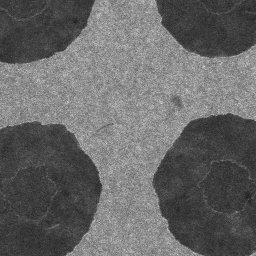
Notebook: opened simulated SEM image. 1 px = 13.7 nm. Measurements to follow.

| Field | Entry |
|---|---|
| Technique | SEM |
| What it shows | ring-shaped grooves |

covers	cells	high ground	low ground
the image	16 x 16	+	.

+++...++++...++.
.....+++++......
.....++++++.....
...++++++++++..+
++++++++++++++++
++++++++++++++++
++++++++++++++++
++++++++++++....
.....++++++.....
.....+++++......
.++...++++...++.
+++...++++...+++
+++...++++...+++
.++...++++......
.....++++++.....
.....+++++++....